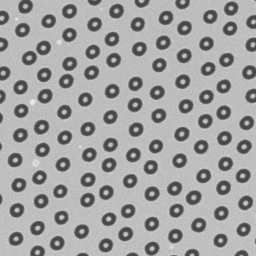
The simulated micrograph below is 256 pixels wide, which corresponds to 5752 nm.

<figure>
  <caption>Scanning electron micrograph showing a regular array of ring-shaped grooves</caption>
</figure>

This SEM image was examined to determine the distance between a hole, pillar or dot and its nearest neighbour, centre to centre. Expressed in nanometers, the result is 510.